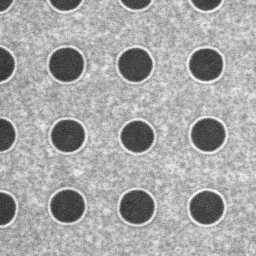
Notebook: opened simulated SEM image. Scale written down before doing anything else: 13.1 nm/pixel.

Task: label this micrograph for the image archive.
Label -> a regular array of raised bodies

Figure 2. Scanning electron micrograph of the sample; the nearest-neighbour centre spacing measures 907 nm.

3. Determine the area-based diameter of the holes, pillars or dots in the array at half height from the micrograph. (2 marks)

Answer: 486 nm